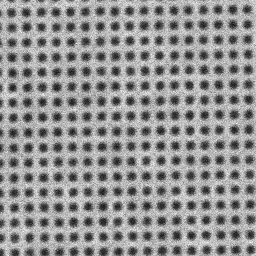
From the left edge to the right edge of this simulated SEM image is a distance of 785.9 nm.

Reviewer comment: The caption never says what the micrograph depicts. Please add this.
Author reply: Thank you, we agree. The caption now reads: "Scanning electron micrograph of a regular array of holes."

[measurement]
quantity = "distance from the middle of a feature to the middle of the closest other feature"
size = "44.9 nanometers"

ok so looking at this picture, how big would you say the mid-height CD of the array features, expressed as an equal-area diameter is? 32 nm